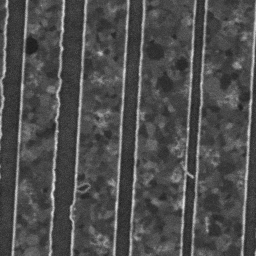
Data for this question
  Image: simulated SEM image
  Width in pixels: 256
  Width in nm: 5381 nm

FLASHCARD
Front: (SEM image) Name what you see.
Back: one or a few lines or trenches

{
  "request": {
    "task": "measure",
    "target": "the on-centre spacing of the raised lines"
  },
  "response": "1300 nanometres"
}